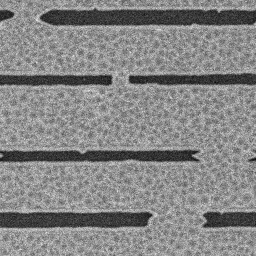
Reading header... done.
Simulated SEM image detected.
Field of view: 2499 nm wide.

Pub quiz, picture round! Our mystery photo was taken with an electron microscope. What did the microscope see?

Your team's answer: one or a few lines or trenches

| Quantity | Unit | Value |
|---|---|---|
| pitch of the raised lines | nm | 668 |